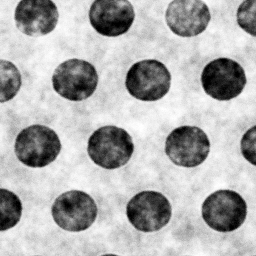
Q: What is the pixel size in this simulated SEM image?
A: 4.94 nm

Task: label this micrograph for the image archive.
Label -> a regular array of holes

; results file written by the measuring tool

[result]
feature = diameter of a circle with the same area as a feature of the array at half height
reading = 223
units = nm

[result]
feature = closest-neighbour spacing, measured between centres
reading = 362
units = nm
